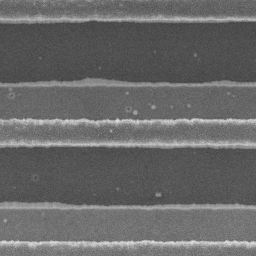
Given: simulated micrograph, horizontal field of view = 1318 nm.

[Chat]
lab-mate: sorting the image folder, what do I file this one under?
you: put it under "lines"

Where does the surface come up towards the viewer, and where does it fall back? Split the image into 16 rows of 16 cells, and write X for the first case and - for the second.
XXXXXXXXXXXXXXXX
----------------
----------------
----------------
----------------
XXXXXXXXXXXXXXXX
XXXXXXXXXXXXXXXX
XXXXXXXXXXXXXXXX
XXXXXXXXXXXXXXXX
----------------
----------------
----------------
----------------
XXXXXXXXXXXXXXXX
XXXXXXXXXXXXXXXX
XXXXXXXXXXXXXXXX